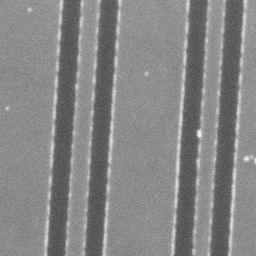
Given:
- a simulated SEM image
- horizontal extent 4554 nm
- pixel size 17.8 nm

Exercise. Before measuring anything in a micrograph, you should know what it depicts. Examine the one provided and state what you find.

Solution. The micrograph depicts lines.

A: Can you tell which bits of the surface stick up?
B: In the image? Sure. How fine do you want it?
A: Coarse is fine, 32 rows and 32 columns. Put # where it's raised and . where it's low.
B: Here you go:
########..##...#########..##...#
########..##...#########..##...#
########..##...########...##...#
#######...##...########...##..##
#######...##...########...##..##
#######...##...########...##..##
#######...##...########...##..##
#######...##..#########...##..##
#######...##..#########...##..##
#######...##..#########...##..##
#######...##..#########...##..##
#######...##..#########..##...##
#######..###..#########..##...##
#######..###..#########..##...##
#######..###..#########..##...##
#######..##...#########..##...##
#######..##...#########..##...##
#######..##...########...##...##
#######..##...########...##...##
######...##...########...##..###
######...##...########...##..###
######...##...########...##..###
######...##...########...##..###
######...##..#########...##..###
######...##..#########...##..###
######...##..#########...##..###
######...##..#########...#...###
######..###..#########..##...###
######..###..#########..##...###
######..###..#########..##...###
######..###..#########..##...###
######..##...#########..##...###